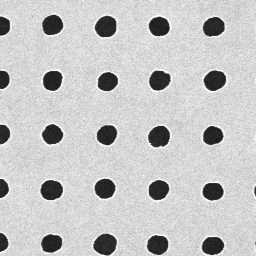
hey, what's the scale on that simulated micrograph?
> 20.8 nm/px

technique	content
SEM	a regular array of holes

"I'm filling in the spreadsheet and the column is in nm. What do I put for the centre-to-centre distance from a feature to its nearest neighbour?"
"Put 1110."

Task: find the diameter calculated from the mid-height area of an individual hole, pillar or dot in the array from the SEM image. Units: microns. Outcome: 0.431